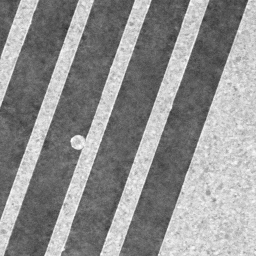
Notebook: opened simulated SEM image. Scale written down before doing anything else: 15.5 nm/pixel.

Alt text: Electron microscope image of parallel lines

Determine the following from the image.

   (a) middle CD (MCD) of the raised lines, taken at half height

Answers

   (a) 220 nanometers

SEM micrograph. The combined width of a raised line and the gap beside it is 825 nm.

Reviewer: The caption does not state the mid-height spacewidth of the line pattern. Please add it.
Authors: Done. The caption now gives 0.606 µm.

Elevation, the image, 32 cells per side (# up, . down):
...##.....##.....##.....##.....#
..##.....##.....##.....###.....#
..##.....##.....##.....##.....##
.###.....#......##.....##.....##
.##.....##.....##.....###....###
.##.....##.....##.....##.....###
##......#......##.....##.....###
##.....##.....##.....##.......##
##.....##.....##.....##.....####
#......#......#......##.....####
#.....##.....##.....##.....#####
#.....##.....##.....##.....#####
.....##......#......##.....#####
.....##.....##.....##.....######
.....##.....##.....##.....######
....##.....##.....###.....######
....##.....##.....##.....#######
....#....####.....##.....#######
...##.....##.....##......#######
...##.....##.....##.....########
...#......##.....##.....########
..##.....##.....##.....#########
..##.....##.....##.....#########
..#......#......##.....#########
.##.....##.....##.....##########
.##.....##.....##.....##########
.#......#......##.....##########
##.....##.....##.....###########
##.....##.....##.....###########
#......#.....###.....###########
#.....##.....##.....############
#.....##.....##.....############